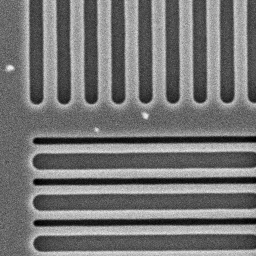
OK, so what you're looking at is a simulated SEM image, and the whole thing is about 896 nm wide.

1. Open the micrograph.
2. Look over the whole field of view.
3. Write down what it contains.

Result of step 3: groups of lines, slits or small figures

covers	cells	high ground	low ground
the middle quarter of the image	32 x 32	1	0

00111000011100011100001110000111
00111000011100011100001110000111
00111000011100011110001110000111
00111000011100011110001110000111
00111000011100011110001110000111
00111000011100011110001110000111
00111000011100001110001110000111
00111000011100001110001110000111
00111000011100011110001111000111
01111100111100011110001111001111
11111111111111111111111111111111
11111111111111111111111111111111
11111111111111111111111111111111
11111111111111111111111111111111
11111111111111111111111111111111
11111111111111111111111111111111
11111111111111111111111111111111
11111111111111111111111111111111
00000000000000000000000000000000
00000000000000000000000000000000
11111111111111111111111111111111
11111111111111111111111111111111
00000000000000000000000000000000
00000000000000000000000000000000
00000000000000000000000000000000
00000000000000000000000000000000
00000000000011111111111111111111
11111111111111111111111111111111
11100000000000111000000000000000
00000000000000000000000000000000
00000001111111111111111111111111
11111111111111111111111111111111